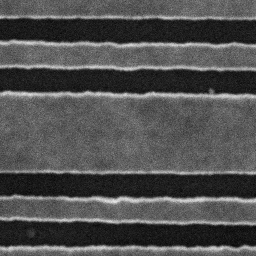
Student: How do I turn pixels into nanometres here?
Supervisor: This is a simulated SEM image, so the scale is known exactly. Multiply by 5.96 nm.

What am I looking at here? lines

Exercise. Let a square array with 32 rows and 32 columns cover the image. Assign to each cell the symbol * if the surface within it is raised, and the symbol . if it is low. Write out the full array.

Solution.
********************************
********************************
................................
................................
................................
**************...*****.**....*..
********************************
********************************
...*..****...*******************
................................
................................
.*..............................
********************************
********************************
********************************
********************************
********************************
********************************
********************************
********************************
********************************
********************************
................................
................................
..*.............................
********************************
********************************
*..*****************************
................................
................................
................................
********************************